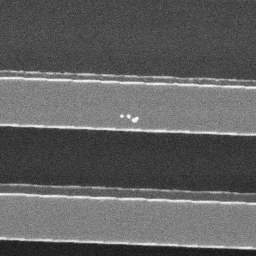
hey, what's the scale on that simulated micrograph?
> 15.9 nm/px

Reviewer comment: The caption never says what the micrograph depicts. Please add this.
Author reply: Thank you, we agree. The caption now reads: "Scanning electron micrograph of lines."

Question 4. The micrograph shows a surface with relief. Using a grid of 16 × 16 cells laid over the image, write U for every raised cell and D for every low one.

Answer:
DDDDDDDDDDDDDDDD
DDDDDDDDDDDDDDDD
DDDDDDDDDDDDDDDD
DDDDDDDDDDDDDDDD
DDDDDDDDDDDDDDDD
UUUUUUUUUUUUUUUU
UUUUUUUUUUUUUUUU
UUUUUUUUUUUUUUUU
DDDDDDDDDDDDDDDD
DDDDDDDDDDDDDDDD
DDDDDDDDDDDDDDDD
DDDDDDDDDDDDDDDD
UUUUUUUUUUUDDDDD
UUUUUUUUUUUUUUUU
UUUUUUUUUUUUUUUU
DDDDDDDDDDDDDDUU